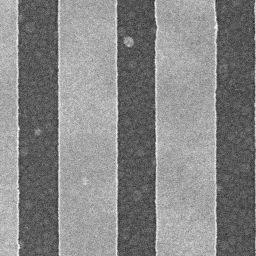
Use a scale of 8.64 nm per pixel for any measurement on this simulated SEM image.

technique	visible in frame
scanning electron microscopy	one or a few lines or trenches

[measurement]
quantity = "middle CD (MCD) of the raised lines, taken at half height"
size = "510 nanometers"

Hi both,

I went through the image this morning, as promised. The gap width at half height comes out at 342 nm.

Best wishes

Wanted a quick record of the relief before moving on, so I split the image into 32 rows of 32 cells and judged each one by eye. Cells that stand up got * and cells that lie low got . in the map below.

**.....********....********.....
**.....********....********.....
**.....********....********.....
**.*...********....********.....
**.....********.....*******.....
**.....********.*..********.....
**.....********....********.....
**.....********....********.....
**.....********....********.....
**.....********....********.....
**.....********....********.....
**.....********....********.....
**.....********....********.....
**.....********.....*******.....
**.....********....********.....
**.....********....********.....
**.....********....********.....
**.....********.....*******.....
**.....********.....*******.....
**.....********.....*******.....
**.....********....********.....
**.....********....********.....
**.....********.....*******.....
**.....********.....*******.....
**.....********..*..*******.....
**.*...********.....*******.....
**.....********.....*******.....
**.....********.....*******.....
**.....********.....*******.....
**.....********.....*******.....
**.....********.....*******.....
**.....********.....*******.....